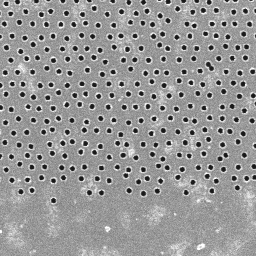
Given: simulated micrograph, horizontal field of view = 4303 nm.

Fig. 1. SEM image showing a regular array of holes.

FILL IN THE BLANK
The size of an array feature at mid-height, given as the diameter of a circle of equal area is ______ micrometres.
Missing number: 0.089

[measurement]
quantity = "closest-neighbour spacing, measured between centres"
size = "184 nanometers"